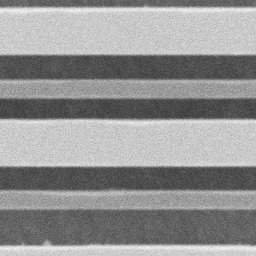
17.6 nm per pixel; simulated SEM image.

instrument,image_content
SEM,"lines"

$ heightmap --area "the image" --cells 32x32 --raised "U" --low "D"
DDDDDDDDDDDDDDDDDDDDDDDDDDDDDDDD
UUUUUUUUUUUUUUUUUUUUUUUUUUUUUUUU
UUUUUUUUUUUUUUUUUUUUUUUUUUUUUUUU
UUUUUUUUUUUUUUUUUUUUUUUUUUUUUUUU
UUUUUUUUUUUUUUUUUUUUUUUUUUUUUUUU
UUUUUUUUUUUUUUUUUUUUUUUUUUUUUUUU
UUUUUUUUUUUUUUUUUUUUUUUUUUUUUUUU
DDDDDDDDDDDDDDDDDDDDDDDDDDDDDDDD
DDDDDDDDDDDDDDDDDDDDDDDDDDDDDDDD
DDDDDDDDDDDDDDDDDDDDDDDDDDDDDDDD
UUUUUUUUUUUUUUUUUUUUUUUUUUUUUUUU
UUUUUUUUUUUUUUUUUUUUUUUUUUUUUUUU
DDDDDDDDDDDDDDDDDDDDDDDDDDDDDDDD
DDDDDDDDDDDDDDDDDDDDDDDDDDDDDDDD
DDDDDDDDDDDDDDDDDDDDDDDDDDDDDDDD
UUUUUUUUUUUUUUUUUUUUUUUUUUUUUUUU
UUUUUUUUUUUUUUUUUUUUUUUUUUUUUUUU
UUUUUUUUUUUUUUUUUUUUUUUUUUUUUUUU
UUUUUUUUUUUUUUUUUUUUUUUUUUUUUUUU
UUUUUUUUUUUUUUUUUUUUUUUUUUUUUUUU
UUUUUUUUUUUUUUUUUUUUUUUUUUUUUUUU
DDDDDDDDDDDDDDDDDDDDDDDDDDDDDDDD
DDDDDDDDDDDDDDDDDDDDDDDDDDDDDDDD
DDDDDDDDDDDDDDDDDDDDDDDDDDDDDDDD
UUUUUUUUUUUUUUUUUUUUUUUUUUUUUUUU
UUUUUUUUUUUUUUUUUUUUUUUUUUUUUUUU
DDDDDDDDDDDDDDDDDDDDDDDDDDDDDDDD
DDDDDDDDDDDDDDDDDDDDDDDDDDDDDDDD
DDDDDDDDDDDDDDDDDDDDDDDDDDDDDDDD
DDDDDDDDDDDDDDDDDDDDDDDDDDDDDDDD
DDDDDDDDDDDDDDDDDDDDDDDDDDDDDDDD
UUUUUUUUUUUUUUUUUUUUUUUUUUUUUUUU